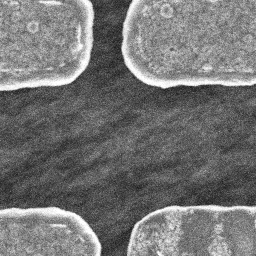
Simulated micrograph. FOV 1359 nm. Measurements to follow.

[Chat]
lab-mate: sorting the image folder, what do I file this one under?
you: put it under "raised bodies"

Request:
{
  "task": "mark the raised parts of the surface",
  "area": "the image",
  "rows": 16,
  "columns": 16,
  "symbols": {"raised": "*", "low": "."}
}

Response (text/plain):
******..********
******..********
******..********
******..********
*****...********
*...............
................
................
................
................
................
................
................
*****....*******
******..*****.**
******..****...*